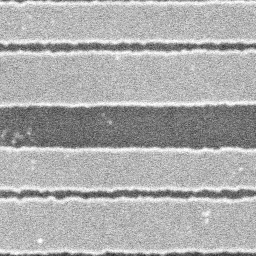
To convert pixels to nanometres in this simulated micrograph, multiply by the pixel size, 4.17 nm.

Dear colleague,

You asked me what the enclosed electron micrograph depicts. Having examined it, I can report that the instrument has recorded lines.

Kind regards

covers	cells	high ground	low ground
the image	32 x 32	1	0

11111111111111111111111111111111
11111111111111111111111111111111
11111111111111111111111111111111
11111111111111111111111111111111
11111111111111111111111111111111
11111111111111111111111111111111
11111111111111111111111111111111
11111111111111111111111111111111
11111111111111111111111111111111
11111111111111111111111111111111
11111111111111111111111111111111
11111111111111111111111111111111
11111111111111111111111111111111
00000000000000000000000000000000
00000000000000000000000000000000
00000000000000000000000000000000
00000000000000000000000000000000
00000000000000000000000000000000
10011000000000000000000000000000
11111111111111111111111111111111
11111111111111111111111111111111
11111111111111111111111111111111
11111111111111111111111111111111
11111111111111111111111111111111
11111111111111111111111111111111
11111111111111111111111111111111
11111111111111111111111111111111
11111111111111111111111111111111
11111111111111111111111111111111
11111111111111111111111111111111
11111111111111111111111111111111
11111111011110111111111001100001